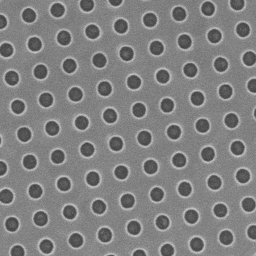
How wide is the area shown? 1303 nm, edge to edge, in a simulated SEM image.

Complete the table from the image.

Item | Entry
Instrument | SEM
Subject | a regular array of holes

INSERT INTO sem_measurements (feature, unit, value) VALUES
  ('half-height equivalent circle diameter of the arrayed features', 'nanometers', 76.6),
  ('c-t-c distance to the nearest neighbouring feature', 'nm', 144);